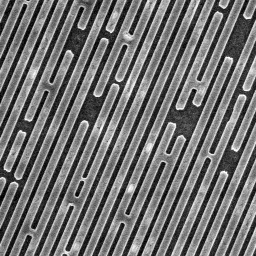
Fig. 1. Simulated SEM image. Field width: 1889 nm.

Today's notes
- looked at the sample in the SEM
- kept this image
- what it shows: parallel lines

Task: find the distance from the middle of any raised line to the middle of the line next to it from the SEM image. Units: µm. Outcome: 0.0995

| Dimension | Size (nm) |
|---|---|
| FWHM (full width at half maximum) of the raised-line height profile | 62.8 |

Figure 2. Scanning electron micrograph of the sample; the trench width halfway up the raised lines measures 39.9 nanometres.